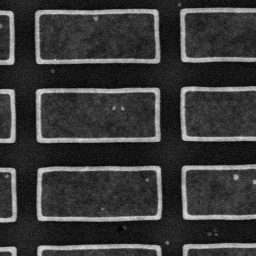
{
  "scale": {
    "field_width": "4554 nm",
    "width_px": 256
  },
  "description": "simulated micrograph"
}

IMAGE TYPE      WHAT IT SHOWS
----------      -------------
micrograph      groups of lines, slits or small figures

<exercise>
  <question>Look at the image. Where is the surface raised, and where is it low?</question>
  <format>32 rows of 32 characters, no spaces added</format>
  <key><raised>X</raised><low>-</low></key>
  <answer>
--------------------------------
------XX----XXXXXXX----XXXXXXXXX
X----XXXXXXXXXXXXXXX---XXXXXXXXX
X----XXXXXXXXXXXXXXX---XXXXXXXXX
X----XXXXXXXXXXXXXXX---XXXXXXXXX
X----XXXXXXXXXXXXXXX---XXXXXXXXX
X----XXXXXXXXXXXXXXX---XXXXXXXXX
X----XXXXXXXXXXXXXX-------------
--------------------------------
--------------------------------
--------------------------------
X----XXXXXXXXXXXXXX----XXXXXXXXX
XX---XXXXXXXXXXXXXXX---XXXXXXXXX
XX---XXXXXXXXXXXXXXX---XXXXXXXXX
XX---XXXXXXXXXXXXXXX---XXXXXXXXX
XX---XXXXXXXXXXXXXXX---XXXXXXXXX
XX---XXXXXXXXXXXXXXX---XXXXXXXXX
X----X--------------------------
--------------------------------
--------------------------------
--------------------------------
X----XXXXXXXXXXXXXXX---XXXXXXXXX
XX---XXXXXXXXXXXXXXX---XXXXXXXXX
XX---XXXXXXXXXXXXXXX---XXXXXXXXX
XX---XXXXXXXXXXXXXXX---XXXXXXXXX
XX---XXXXXXXXXXXXXXX---XXXXXXXXX
XX---XXXXXXXXXXXXXXX---XXXXXXXXX
--------------------------------
--------------------------------
--------------------------------
--------------------------------
XX---XXXXXXXXXXXXXXX---XXXXXXXXX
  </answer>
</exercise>